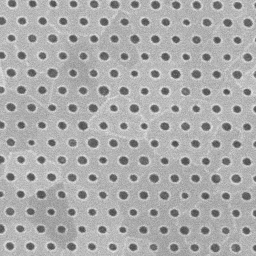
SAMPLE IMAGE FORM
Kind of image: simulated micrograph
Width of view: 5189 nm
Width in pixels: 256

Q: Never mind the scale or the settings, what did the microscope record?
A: a regular array of holes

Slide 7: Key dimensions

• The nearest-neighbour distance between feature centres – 404 nanometres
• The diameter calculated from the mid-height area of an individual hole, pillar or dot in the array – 182 nm